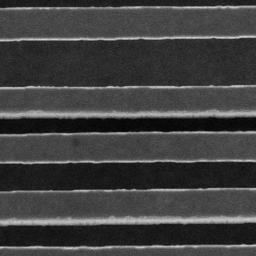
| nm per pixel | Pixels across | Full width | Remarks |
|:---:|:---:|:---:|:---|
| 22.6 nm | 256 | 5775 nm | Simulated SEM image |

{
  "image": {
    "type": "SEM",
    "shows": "lines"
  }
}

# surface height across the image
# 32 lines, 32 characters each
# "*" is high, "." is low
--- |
................................
********************************
********************************
********************************
********************************
................................
................................
................................
................................
................................
................................
********************************
********************************
********************************
**************************.**...
................................
.................*.*************
********************************
********************************
********************************
................................
................................
................................
................................
********************************
********************************
********************************
********************************
................................
................................
................................
********************************